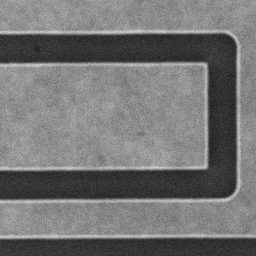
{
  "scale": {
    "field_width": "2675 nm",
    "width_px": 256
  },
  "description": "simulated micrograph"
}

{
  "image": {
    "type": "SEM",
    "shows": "groups of lines, slits or small figures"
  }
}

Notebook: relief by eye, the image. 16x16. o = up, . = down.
oooooooooooooooo
oooooooooooooooo
...............o
...............o
ooooooooooooo..o
ooooooooooooo..o
ooooooooooooo..o
ooooooooooooo..o
ooooooooooooo..o
ooooooooooooo..o
ooooooooooooo..o
...............o
.............ooo
oooooooooooooooo
oooooooooooooooo
................